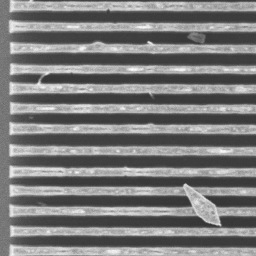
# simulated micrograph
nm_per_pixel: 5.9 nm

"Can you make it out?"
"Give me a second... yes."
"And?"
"parallel lines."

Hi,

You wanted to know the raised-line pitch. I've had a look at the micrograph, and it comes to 121 nm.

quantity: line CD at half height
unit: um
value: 0.0568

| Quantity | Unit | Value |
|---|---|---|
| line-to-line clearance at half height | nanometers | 62.7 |